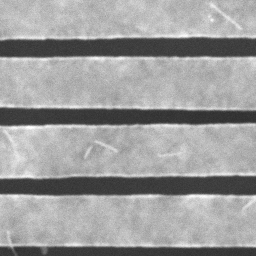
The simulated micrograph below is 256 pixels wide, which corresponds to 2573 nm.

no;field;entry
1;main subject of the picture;lines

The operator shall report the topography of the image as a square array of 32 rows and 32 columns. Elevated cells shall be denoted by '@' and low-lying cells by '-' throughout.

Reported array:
@@@@@@@@@@@@@@@@@@@@@@@@@@@@@@@@
@@@@@@@@@@@@@@@@@@@@@@@@@@@@@@@@
@@@@@@@@@@@@@@@@@@@@@@@@@@@@@@@@
@@@@@@@@@@@@@@@@@@@@@@@@@@@@@@@@
@@@@@@@@@@@@@@@@@@@@@@@@@@@@@@@@
--------------------------------
--------------------------------
@@@@@@@@@@@@@@@@@@@@@@@@@@@@@@@@
@@@@@@@@@@@@@@@@@@@@@@@@@@@@@@@@
@@@@@@@@@@@@@@@@@@@@@@@@@@@@@@@@
@@@@@@@@@@@@@@@@@@@@@@@@@@@@@@@@
@@@@@@@@@@@@@@@@@@@@@@@@@@@@@@@@
@@@@@@@@@@@@@@@@@@@@@@@@@@@@@@@@
-------------@-@@@@@@@@@@@@@@@@@
--------------------------------
---------------------------@@@@@
@@@@@@@@@@@@@@@@@@@@@@@@@@@@@@@@
@@@@@@@@@@@@@@@@@@@@@@@@@@@@@@@@
@@@@@@@@@@@@@@@@@@@@@@@@@@@@@@@@
@@@@@@@@@@@@@@@@@@@@@@@@@@@@@@@@
@@@@@@@@@@@@@@@@@@@@@@@@@@@@@@@@
@@@@@@@@@@@@@@@@@@@@@@@@@@@@@@@@
--------------------------------
--------------------------------
@@@@@-----@@----@@@@@@-@@@@@@---
@@@@@@@@@@@@@@@@@@@@@@@@@@@@@@@@
@@@@@@@@@@@@@@@@@@@@@@@@@@@@@@@@
@@@@@@@@@@@@@@@@@@@@@@@@@@@@@@@@
@@@@@@@@@@@@@@@@@@@@@@@@@@@@@@@@
@@@@@@@@@@@@@@@@@@@@@@@@@@@@@@@@
@@@@@@@@@@@@@@@@@@@@@@@@@@@@@@@@
--------------------------------